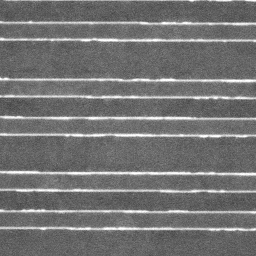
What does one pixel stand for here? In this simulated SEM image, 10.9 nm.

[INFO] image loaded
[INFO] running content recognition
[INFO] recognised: lines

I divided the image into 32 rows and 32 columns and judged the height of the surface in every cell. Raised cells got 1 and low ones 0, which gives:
00000000000000000000000000000000
00000000000000000000000000000000
00000000000000000000000000000000
11111111111111111111111111111111
11111111111111111111111111111111
00000000000000000000000000000000
00000000000000000000000000000000
00000000000000000000000000000000
00000000000000000000000000000000
00000000000000000000000000000000
11111111111111111111111111111111
11111111111111111111111111111111
00000000000000000000000000000000
00000000000000000000000000000000
00000000000000000000000000000000
11111111111111111111111111111111
11111111111111111111111111111111
00000000000000000000000000000000
00000000000000000000000000000000
00000000000000000000000000000000
00000000000000000000000000000000
00000000000000000000000000000000
11111111111111111111111111111111
11111111111111111111111111111111
00000000000000000000000000000000
00000000000000000000000000000000
11111111111111111110011100000000
11111111111111111111111111111111
11111111111111111111111111111111
00000000000000000000000000000000
00000000000000000000000000000000
00000000000000000000000000000000